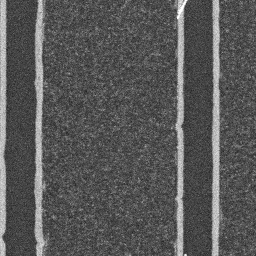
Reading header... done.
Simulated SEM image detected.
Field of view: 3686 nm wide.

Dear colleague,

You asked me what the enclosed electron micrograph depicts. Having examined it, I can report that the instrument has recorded one or a few lines or trenches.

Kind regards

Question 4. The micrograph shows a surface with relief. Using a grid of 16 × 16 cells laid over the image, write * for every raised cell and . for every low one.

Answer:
..*********..***
..*********..***
..*********..***
..*********...**
..*********...**
..*********...**
..*********...**
..*********...**
..*********...**
..*********...**
..*********..***
..*********..***
..*********..***
..*********..***
..*********..***
..*********..***